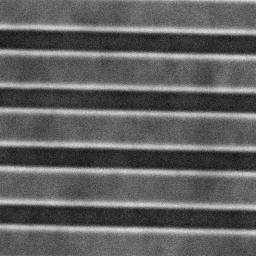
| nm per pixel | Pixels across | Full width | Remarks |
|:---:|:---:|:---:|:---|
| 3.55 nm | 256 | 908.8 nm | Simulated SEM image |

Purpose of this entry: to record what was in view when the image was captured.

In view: groups of lines, slits or small figures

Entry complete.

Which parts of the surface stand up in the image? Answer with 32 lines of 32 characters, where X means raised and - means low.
XXXXXXXXXXXXXXXXXXXXXXXXXXXXXXXX
XXXXXXXXXXXXXXXXXXXXXXXXXXXXXXXX
XXXXXXXXXXXXXXXXXXXXXXXXXXXXXXXX
XXXXXXXXXXXXXXXXXXXXXXXXXXXXXXXX
--------------------------------
--------------------------------
XXXXX---------------------------
XXXXXXXXXXXXXXXXXXXXXXXXXXXXXXXX
XXXXXXXXXXXXXXXXXXXXXXXXXXXXXXXX
XXXXXXXXXXXXXXXXXXXXXXXXXXXXXXXX
XXXXXXXXXXXXXXXXXXXXXXXXXXXXXXXX
--------------------------------
--------------------------------
--------------------------------
XXXXXXXXXXXXXXXXXXXXXXXXXXXXXXXX
XXXXXXXXXXXXXXXXXXXXXXXXXXXXXXXX
XXXXXXXXXXXXXXXXXXXXXXXXXXXXXXXX
XXXXXXXXXXXXXXXXXXXXXXXXXXXXXXXX
------------------XXXXXXXXXXXXXX
--------------------------------
--------------------------------
XXXXXXXXXXXXXXXXXXXXXXX---------
XXXXXXXXXXXXXXXXXXXXXXXXXXXXXXXX
XXXXXXXXXXXXXXXXXXXXXXXXXXXXXXXX
XXXXXXXXXXXXXXXXXXXXXXXXXXXXXXXX
------XXXXXXXXXXXXXXXXXXXXXXXXXX
--------------------------------
--------------------------------
XXXXXXXXX-----------------------
XXXXXXXXXXXXXXXXXXXXXXXXXXXXXXXX
XXXXXXXXXXXXXXXXXXXXXXXXXXXXXXXX
XXXXXXXXXXXXXXXXXXXXXXXXXXXXXXXX